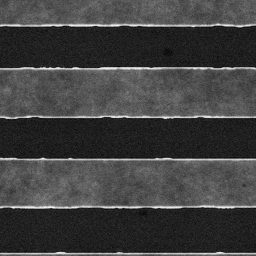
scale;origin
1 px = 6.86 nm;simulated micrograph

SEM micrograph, lines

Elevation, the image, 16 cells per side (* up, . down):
****************
****************
................
................
****************
****************
****************
................
................
................
****************
****************
****************
................
................
................